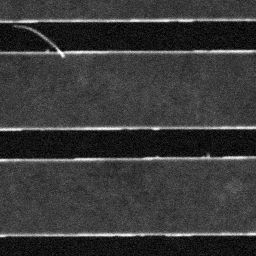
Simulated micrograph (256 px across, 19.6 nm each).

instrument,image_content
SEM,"lines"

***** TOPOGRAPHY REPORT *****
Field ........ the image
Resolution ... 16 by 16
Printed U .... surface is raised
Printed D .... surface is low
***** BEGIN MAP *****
UUUUUUUUUUUUUUUU
DDDDDDDDDDDDDDDD
DDDDDDDDDDDDDDDD
UUUUUUUUUUUUUUUU
UUUUUUUUUUUUUUUU
UUUUUUUUUUUUUUUU
UUUUUUUUUUUUUUUU
UUUUUUUUUUUUUUUU
DDDDDDDDDDDDDDDD
DDDDDDDDDDDDDDDD
UUUUUUUUUUUUUUUU
UUUUUUUUUUUUUUUU
UUUUUUUUUUUUUUUU
UUUUUUUUUUUUUUUU
UUUUUUUUUUUUUUUU
DDDDDDDDDDDDDDDD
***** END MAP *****